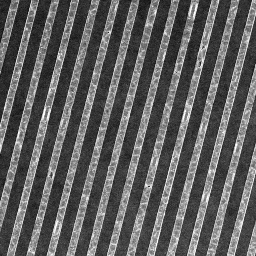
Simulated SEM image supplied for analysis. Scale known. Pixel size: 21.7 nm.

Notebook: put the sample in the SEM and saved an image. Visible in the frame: parallel lines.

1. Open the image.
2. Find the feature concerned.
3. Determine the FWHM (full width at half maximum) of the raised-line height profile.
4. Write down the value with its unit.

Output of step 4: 152 nm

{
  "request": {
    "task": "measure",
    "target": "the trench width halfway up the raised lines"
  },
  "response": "273 nanometers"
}